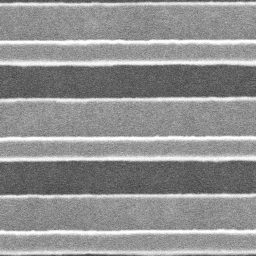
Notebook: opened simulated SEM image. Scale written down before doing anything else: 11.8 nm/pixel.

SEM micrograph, lines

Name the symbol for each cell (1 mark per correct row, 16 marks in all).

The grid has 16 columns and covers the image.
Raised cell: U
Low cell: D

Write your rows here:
UUUUUUUUUUUUUUUU
UUUUUUUUUUUUUUUU
UUUUUUUUUUUUUUUU
UUUUUUUUUUUUUUUU
DDDDDDDDDDDDDDDD
DDDDDDDDDDDDDDDD
UUUUUUUUUUUUUUUU
UUUUUUUUUUUUUUUU
UUUUUUUUUUUUUUUU
UUUUUUUUUUUUUUUU
DDDDDDDDDDDDDDDD
DDDDDDDDDDDDDDDD
UUUUUUUUUUUUUUUU
UUUUUUUUUUUUUUUU
UUUUUUUUUUUUUUUU
UUUUUUUUUUUUUUUU